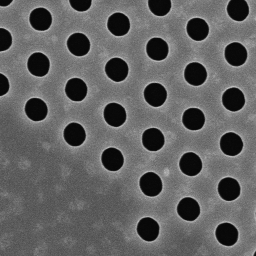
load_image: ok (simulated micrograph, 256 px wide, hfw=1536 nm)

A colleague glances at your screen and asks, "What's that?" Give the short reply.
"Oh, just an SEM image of a regular array of holes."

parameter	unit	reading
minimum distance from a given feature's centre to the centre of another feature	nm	269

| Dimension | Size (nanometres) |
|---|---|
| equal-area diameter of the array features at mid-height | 139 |